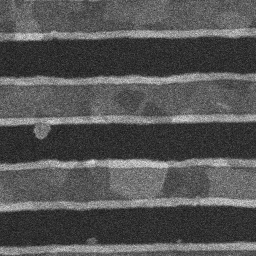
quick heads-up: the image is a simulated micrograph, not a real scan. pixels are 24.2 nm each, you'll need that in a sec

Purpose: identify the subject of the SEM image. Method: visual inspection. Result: one or a few lines or trenches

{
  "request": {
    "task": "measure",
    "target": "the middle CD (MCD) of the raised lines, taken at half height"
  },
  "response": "965 nm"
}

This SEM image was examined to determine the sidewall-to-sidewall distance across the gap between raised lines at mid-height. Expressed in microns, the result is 1.07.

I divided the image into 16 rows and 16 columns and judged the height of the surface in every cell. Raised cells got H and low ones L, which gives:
HHHHHHHHHHHHHHHH
HHHHHHHHHHHHHHHH
LLLLLLLLLLLLLLLL
LLLLLLLLLLLLLLLL
LLLLLLLLLLLLLLLL
HHHHHHHHHHHHHHHH
HHHHHHHHHHHHHHHH
HHHHLLHLLHLLLLLL
LLLLLLLLLLLLLLLL
LLLLLLLLLLLLLLLL
HHHHHHHHHHHHHHHH
HHHHHHHHHHHHHHHH
HHHHHHHHHHHHHHHH
LLLLLLLLLLLLLLLL
LLLLLLLLLLLLLLLL
LLLLLLLLLHHHHHHH